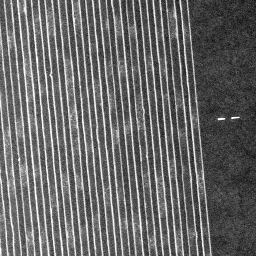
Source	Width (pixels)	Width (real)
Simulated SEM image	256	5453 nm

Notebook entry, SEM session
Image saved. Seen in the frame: parallel lines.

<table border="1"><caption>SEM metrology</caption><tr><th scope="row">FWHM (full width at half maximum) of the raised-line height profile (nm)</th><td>164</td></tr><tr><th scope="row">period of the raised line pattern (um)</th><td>0.287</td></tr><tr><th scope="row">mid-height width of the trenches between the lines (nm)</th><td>127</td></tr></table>